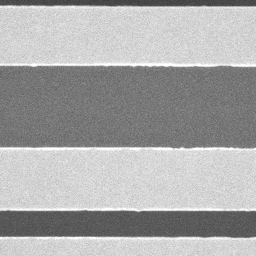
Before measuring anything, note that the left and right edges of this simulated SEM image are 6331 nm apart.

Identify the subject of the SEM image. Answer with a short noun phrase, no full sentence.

lines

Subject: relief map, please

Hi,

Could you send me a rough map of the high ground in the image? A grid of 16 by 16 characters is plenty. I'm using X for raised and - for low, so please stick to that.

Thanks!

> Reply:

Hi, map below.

XXXXXXXXXXXXXXXX
XXXXXXXXXXXXXXXX
XXXXXXXXXXXXXXXX
XXXXXXXXXXXXXXXX
----------------
----------------
----------------
----------------
----------------
XXXXXXXXXXXXXXXX
XXXXXXXXXXXXXXXX
XXXXXXXXXXXXXXXX
XXXXXXXXXXXXXXXX
----------------
----------------
XXXXXXXXXXXXXXXX